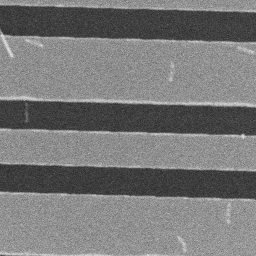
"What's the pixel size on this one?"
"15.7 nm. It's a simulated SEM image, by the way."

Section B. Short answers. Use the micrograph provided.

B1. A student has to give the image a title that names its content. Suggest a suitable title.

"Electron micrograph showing lines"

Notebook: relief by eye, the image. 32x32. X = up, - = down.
XXXXXXXXXXXXXXXXXXXXXXXXXXXXXXXX
--------------------------------
--------------------------------
--------------------------------
XX------------------------------
XXXXXXXXXXXXXXXXXXXXXXXXXXXXXXXX
XXXXXXXXXXXXXXXXXXXXXXXXXXXXXXXX
XXXXXXXXXXXXXXXXXXXXXXXXXXXXXXXX
XXXXXXXXXXXXXXXXXXXXXXXXXXXXXXXX
XXXXXXXXXXXXXXXXXXXXXXXXXXXXXXXX
XXXXXXXXXXXXXXXXXXXXXXXXXXXXXXXX
XXXXXXXXXXXXXXXXXXXXXXXXXXXXXXXX
----XXXXXXXXXXXXXXXXXXXXXXXXXXXX
--------------------------------
--------------------------------
--------------------------------
XXXXXXXXXXXXXX------------------
XXXXXXXXXXXXXXXXXXXXXXXXXXXXXXXX
XXXXXXXXXXXXXXXXXXXXXXXXXXXXXXXX
XXXXXXXXXXXXXXXXXXXXXXXXXXXXXXXX
----XXXXXXXXXXXXXXXXXXXXXXXXXXXX
--------------------------------
--------------------------------
--------------------------------
XXXXXXXXXXXXXXXXX---------------
XXXXXXXXXXXXXXXXXXXXXXXXXXXXXXXX
XXXXXXXXXXXXXXXXXXXXXXXXXXXXXXXX
XXXXXXXXXXXXXXXXXXXXXXXXXXXXXXXX
XXXXXXXXXXXXXXXXXXXXXXXXXXXXXXXX
XXXXXXXXXXXXXXXXXXXXXXXXXXXXXXXX
XXXXXXXXXXXXXXXXXXXXXXXXXXXXXXXX
XXXXXXXXXXXXXXXXXXXXXXXXXXXXXXXX